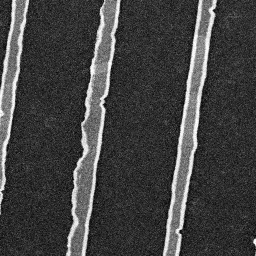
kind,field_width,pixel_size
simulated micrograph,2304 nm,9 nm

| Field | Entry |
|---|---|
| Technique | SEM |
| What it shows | one or a few lines or trenches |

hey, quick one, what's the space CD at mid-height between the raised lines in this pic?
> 0.718 microns